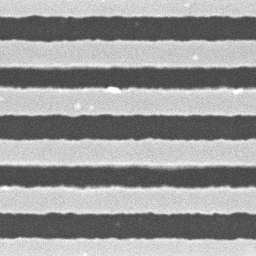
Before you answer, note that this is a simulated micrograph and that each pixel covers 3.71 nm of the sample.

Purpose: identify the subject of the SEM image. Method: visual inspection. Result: lines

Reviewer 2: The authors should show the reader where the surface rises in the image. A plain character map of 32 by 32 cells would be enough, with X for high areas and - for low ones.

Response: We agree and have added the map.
XXXXXXXXXXXXXXXXXXXXXXXXXXXXXXXX
XXXXXXXXXXXXXXXXXXXXXXXXXXXXXXXX
--------------------------------
--------------------------------
--------------------------------
XXXXXXXXXXXXXXXXXXXXXXXXXXXXXXXX
XXXXXXXXXXXXXXXXXXXXXXXXXXXXXXXX
XXXXXXXXXXXXXXXXXXXXXXXXXXXXXXXX
--------------------------------
--------------------------------
--------------------------------
XXXXXXXXXXXXXXXXXXXXXXXXXXXXXXXX
XXXXXXXXXXXXXXXXXXXXXXXXXXXXXXXX
XXXXXXXXXXXXXXXXXXXXXXXXXXXXXXXX
--------------------------------
--------------------------------
--------------------------------
-----X-X--XX------XX-------X---X
XXXXXXXXXXXXXXXXXXXXXXXXXXXXXXXX
XXXXXXXXXXXXXXXXXXXXXXXXXXXXXXXX
XXXXXXXXXXXXXXXXXXXXXXXXXXXXXXXX
--------------------------------
--------------------------------
XXX-XXXXX---XXXX----XX----XXX--X
XXXXXXXXXXXXXXXXXXXXXXXXXXXXXXXX
XXXXXXXXXXXXXXXXXXXXXXXXXXXXXXXX
XXXXXXXXXXXXXXXXXXXXXXXXXXXXXXXX
--------------------------------
--------------------------------
--------------------------------
XXXXXXXXXXXXXXXXXXXXXXXXXXXXXXXX
XXXXXXXXXXXXXXXXXXXXXXXXXXXXXXXX